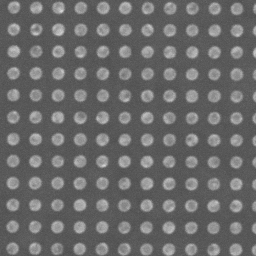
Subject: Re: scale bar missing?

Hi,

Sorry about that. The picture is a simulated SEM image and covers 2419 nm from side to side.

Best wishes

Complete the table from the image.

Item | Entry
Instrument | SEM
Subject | a regular array of raised bodies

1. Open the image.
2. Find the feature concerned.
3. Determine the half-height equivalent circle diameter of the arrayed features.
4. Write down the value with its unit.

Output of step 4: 11.3 pixels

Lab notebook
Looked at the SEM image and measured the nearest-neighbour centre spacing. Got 206 nanometres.